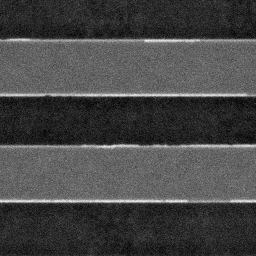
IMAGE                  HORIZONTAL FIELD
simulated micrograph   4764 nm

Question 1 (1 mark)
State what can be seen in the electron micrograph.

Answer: lines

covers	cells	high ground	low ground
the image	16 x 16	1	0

0000000000000000
0000000000000000
1100000000000000
1111111111111111
1111111111111111
1111111111111111
0000000000000000
0000000000000000
0000000000000000
1111111111111111
1111111111111111
1111111111111111
1111111111111111
0000000000000000
0000000000000000
0000000000000000